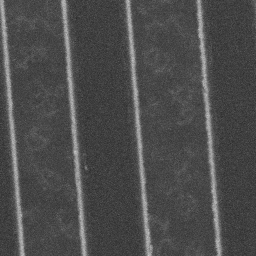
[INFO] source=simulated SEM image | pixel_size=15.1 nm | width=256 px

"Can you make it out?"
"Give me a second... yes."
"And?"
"one or a few lines or trenches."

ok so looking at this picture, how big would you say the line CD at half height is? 1010 nm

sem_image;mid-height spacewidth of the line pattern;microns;0.953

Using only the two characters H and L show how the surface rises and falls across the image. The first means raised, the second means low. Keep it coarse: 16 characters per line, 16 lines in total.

HHHHLLLLHHHHLLLL
HHHHLLLLHHHHHLLL
HHHHLLLLHHHHHLLL
HHHHLLLLHHHHHLLL
HHHHLLLLHHHHHLLL
LHHHLLLLHHHHHLLL
LHHHHLLLLHHHHLLL
LHHHHLLLLHHHHLLL
LHHHHLLLLHHHHLLL
LHHHHLLLLHHHHLLL
LHHHHLLLLHHHHLLL
LHHHHLLLLHHHHLLL
LHHHHLLLLHHHHLLL
LHHHHLLLLHHHHHLL
LHHHHLLLLHHHHHLL
LHHHHLLLLHHHHHLL